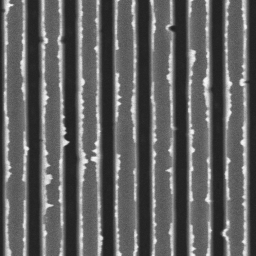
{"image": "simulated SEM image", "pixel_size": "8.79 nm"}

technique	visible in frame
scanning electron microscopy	parallel lines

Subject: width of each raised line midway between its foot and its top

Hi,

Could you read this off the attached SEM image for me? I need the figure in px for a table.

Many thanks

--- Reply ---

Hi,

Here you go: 23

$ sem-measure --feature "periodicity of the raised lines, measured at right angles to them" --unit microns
0.324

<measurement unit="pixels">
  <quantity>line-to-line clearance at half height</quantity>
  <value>13.8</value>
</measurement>